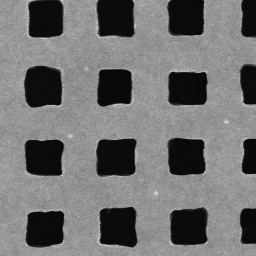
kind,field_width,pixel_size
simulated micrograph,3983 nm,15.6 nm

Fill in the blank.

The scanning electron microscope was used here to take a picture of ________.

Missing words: a regular array of holes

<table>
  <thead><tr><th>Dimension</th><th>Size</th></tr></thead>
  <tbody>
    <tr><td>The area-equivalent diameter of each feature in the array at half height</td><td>40.2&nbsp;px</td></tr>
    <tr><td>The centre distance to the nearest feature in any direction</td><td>1080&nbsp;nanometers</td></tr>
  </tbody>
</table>